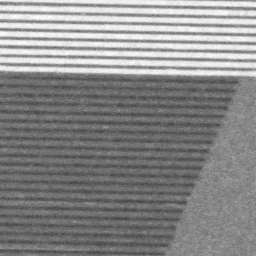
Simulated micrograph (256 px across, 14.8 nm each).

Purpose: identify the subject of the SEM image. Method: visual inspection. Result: parallel lines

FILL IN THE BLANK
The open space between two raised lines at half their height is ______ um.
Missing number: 0.0627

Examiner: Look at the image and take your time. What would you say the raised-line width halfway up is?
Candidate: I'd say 62.7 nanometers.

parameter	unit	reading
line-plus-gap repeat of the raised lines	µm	0.128